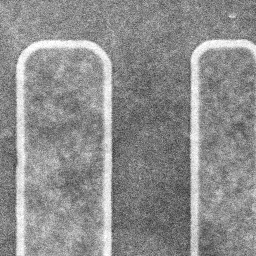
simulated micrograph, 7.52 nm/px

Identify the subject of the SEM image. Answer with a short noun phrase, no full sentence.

one or a few lines or trenches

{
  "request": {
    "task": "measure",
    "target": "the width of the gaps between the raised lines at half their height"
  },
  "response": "644 nm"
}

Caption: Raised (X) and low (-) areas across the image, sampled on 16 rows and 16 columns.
----------------
----------------
----------------
--XXXX------XXXX
-XXXXXX-----XXXX
-XXXXXX-----XXXX
-XXXXXX-----XXXX
-XXXXXX-----XXXX
-XXXXXX-----XXXX
-XXXXXX-----XXXX
-XXXXXX-----XXXX
-XXXXXX-----XXXX
-XXXXXX-----XXXX
-XXXXXX-----XXXX
-XXXXXX-----XXXX
-XXXXXX-----XXXX